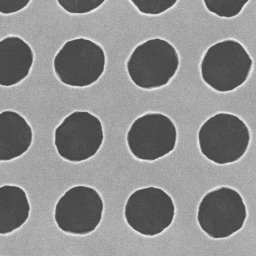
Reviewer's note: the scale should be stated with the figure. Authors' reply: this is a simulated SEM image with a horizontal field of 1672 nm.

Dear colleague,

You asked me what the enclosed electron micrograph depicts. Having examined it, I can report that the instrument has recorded a regular array of holes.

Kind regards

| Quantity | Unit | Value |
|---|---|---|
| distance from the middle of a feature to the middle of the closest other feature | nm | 471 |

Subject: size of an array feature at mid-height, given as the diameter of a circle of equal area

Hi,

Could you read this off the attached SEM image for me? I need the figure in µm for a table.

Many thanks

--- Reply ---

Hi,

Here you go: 0.32